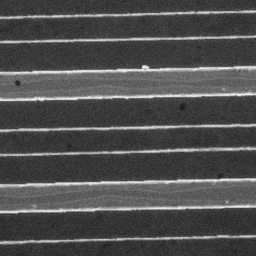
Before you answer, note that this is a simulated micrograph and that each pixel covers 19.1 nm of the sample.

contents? lines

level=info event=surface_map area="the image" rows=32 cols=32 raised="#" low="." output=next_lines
................................
................................
################################
################################
################################
................................
................................
................................
............................####
################################
################################
################################
###.............................
................................
................................
................................
################################
################################
################################
................................
................................
................................
..............................##
################################
################################
################################
................................
................................
................................
................................
################################
################################